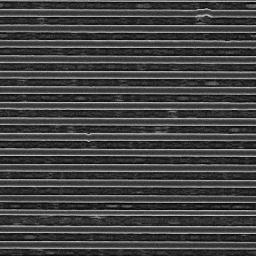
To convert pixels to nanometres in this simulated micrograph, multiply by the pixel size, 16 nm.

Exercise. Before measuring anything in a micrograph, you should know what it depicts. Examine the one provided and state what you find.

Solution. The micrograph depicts parallel lines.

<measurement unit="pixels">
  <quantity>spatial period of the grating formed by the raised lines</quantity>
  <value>15.5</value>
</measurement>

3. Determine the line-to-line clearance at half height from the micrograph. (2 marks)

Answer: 0.134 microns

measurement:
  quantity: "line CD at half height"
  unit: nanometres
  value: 122